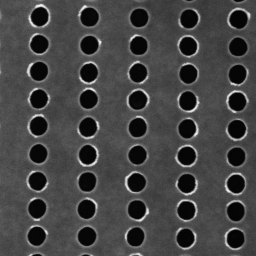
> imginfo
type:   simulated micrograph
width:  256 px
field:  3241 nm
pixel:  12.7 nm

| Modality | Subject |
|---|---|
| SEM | a regular array of holes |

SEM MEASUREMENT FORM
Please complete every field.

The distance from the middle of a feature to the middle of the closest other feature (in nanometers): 345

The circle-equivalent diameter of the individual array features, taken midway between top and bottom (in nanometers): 233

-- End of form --